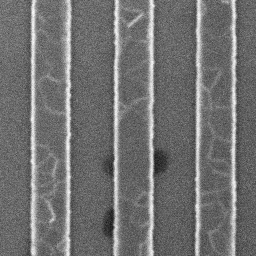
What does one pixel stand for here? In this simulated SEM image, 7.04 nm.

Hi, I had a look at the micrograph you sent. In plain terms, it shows lines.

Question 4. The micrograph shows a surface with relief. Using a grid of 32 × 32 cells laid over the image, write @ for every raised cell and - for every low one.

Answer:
----@@@@@------@@@@------@@@@---
----@@@@@------@@@@------@@@@---
----@@@@@------@@@@------@@@@---
----@@@@@------@@@@------@@@@---
----@@@@@------@@@@------@@@@---
----@@@@@------@@@@------@@@@---
----@@@@@------@@@@------@@@@---
----@@@@@-----@@@@@------@@@@---
----@@@@@-----@@@@@------@@@@---
----@@@@@------@@@@------@@@@---
----@@@@@------@@@@------@@@@---
----@@@@@------@@@@------@@@@---
----@@@@@------@@@@------@@@@---
----@@@@@-----@@@@@------@@@@---
----@@@@@------@@@@------@@@@---
----@@@@@------@@@@------@@@@---
----@@@@@-----@@@@@------@@@@---
----@@@@@-----@@@@@------@@@@---
----@@@@@-----@@@@@------@@@@---
----@@@@@-----@@@@@------@@@@---
----@@@@@-----@@@@@------@@@@---
----@@@@@-----@@@@@------@@@@---
----@@@@@-----@@@@@------@@@@---
----@@@@@-----@@@@@------@@@@---
----@@@@@-----@@@@@------@@@@---
----@@@@@------@@@@------@@@@---
----@@@@@------@@@@------@@@@---
----@@@@@------@@@@------@@@@---
----@@@@@-----@@@@@------@@@@---
----@@@@@-----@@@@@------@@@@---
----@@@@@-----@@@@@------@@@@---
----@@@@@-----@@@@@------@@@@---